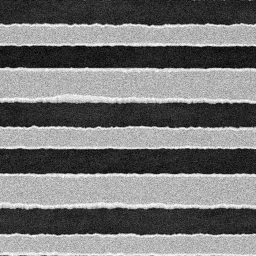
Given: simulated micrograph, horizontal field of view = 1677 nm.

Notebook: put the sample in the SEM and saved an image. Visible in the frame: lines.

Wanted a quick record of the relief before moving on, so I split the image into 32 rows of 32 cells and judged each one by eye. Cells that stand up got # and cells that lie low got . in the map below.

................................
................................
................................
################################
################################
################################
................................
................................
###.............................
################################
################################
################################
#######....#####################
................................
................................
................................
################################
################################
##.###########################.#
................................
................................
................................
################################
################################
################################
################################
................................
................................
................................
################################
################################
################################